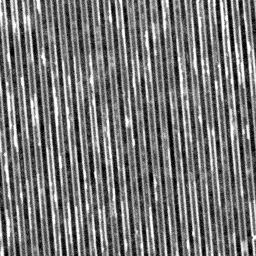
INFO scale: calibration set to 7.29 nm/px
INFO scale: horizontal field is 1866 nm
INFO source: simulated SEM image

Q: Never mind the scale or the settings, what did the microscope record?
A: parallel lines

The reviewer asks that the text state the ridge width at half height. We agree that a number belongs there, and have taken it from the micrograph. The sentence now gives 45.4 nm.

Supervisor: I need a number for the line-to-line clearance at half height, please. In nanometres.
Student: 39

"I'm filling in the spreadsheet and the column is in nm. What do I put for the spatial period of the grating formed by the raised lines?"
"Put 84.5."